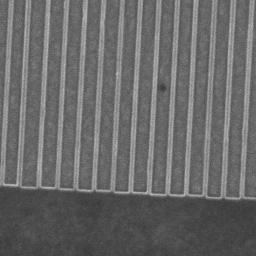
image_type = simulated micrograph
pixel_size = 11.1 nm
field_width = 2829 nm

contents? parallel lines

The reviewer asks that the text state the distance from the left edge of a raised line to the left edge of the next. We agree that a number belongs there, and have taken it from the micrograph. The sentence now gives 204 nm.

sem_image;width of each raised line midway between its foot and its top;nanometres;42.8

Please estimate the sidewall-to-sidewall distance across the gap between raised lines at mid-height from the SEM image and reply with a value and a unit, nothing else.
162 nm